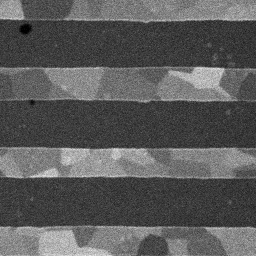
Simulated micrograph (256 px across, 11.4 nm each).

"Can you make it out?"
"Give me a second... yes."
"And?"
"one or a few lines or trenches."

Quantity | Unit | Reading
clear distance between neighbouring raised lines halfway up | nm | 559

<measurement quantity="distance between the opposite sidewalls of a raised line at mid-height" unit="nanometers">336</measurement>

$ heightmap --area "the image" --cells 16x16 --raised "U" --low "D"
UUUUUUUUUUUUUUUU
DDDDDDDDDDDDDDDD
DDDDDDDDDDDDDDDD
DDDDDDDDDDDDDDDD
UUUUUUUUUUUUUUUU
UUUUUUUUUUUUUUUU
DDDDDDDDDDDDDDDD
DDDDDDDDDDDDDDDD
DDDDDDDDDDDDDDDD
UUUUUUUUUUUUUUUU
UUUUUUUUUUUUUUUU
DDDDDDDDDDDDDDDD
DDDDDDDDDDDDDDDD
DDDDDDDDDDDDDDDD
UUUUUUUUUUUUUUUU
UUUUUUUUUUUUUUUU